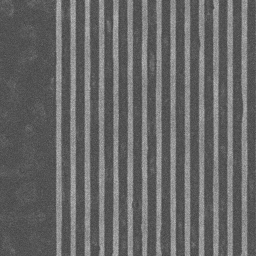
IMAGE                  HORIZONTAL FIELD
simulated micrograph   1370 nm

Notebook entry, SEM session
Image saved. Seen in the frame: parallel lines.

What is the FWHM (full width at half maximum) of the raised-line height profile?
24.7 nanometres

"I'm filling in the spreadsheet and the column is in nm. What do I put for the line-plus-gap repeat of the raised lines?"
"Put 76.3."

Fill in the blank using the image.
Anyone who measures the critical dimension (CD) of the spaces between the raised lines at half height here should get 9.25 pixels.